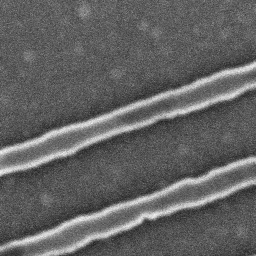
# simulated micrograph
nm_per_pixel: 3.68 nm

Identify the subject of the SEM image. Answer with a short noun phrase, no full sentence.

one or a few lines or trenches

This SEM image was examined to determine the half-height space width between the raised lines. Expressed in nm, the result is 252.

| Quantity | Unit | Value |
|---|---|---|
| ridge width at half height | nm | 83.8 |